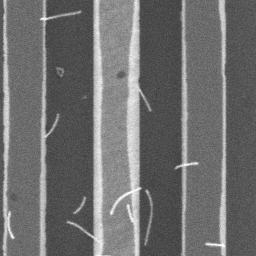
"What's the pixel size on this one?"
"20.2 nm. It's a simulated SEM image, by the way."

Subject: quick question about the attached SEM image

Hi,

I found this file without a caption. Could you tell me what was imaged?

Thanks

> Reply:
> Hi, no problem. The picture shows lines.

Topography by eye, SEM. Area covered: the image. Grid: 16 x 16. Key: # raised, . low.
###...###..###..
###...###..###..
###...###..###..
###...##...###..
###...##...###..
###...###..###..
###...##....##..
###...##....##..
###...##....##..
###...##....##..
###...##...###..
###...###..###..
###...###..###..
###...###..###..
###...###..###..
###...###..###..